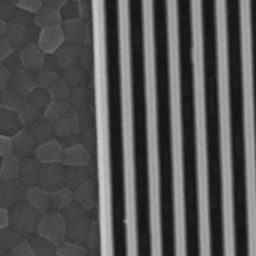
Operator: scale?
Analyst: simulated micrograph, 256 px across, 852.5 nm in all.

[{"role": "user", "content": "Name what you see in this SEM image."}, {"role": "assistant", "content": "parallel lines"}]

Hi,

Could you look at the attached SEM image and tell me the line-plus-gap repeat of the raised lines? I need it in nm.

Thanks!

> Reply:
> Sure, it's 81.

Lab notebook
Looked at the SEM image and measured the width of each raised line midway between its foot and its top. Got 34.5 nm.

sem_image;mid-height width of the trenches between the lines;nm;46.1